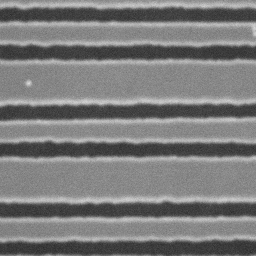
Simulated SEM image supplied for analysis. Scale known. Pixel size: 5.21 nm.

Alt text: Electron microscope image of lines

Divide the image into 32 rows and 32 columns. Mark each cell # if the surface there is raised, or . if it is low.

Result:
################################
................................
................................
################################
################################
################################
................................
....#.#.........#....###.....#..
################################
################################
################################
################################
################################
................................
................................
################################
################################
################################
................................
................................
################################
################################
################################
################################
################################
................................
................................
################################
################################
################################
................................
................................